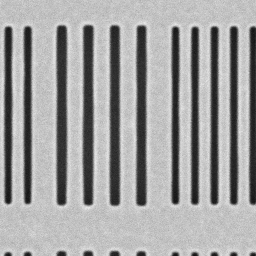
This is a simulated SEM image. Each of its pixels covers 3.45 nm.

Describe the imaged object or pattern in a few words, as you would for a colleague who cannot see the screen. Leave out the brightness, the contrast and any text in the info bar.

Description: groups of lines, slits or small figures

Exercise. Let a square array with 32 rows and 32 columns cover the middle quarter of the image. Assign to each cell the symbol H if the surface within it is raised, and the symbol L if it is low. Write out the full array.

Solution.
LHHHHLLHHHHLLLHHHHLLLHHHHHHLLHHH
LHHHHLLHHHHLLLHHHHLLLHHHHHHLLHHH
LHHHHLLHHHHLLLHHHHLLLHHHHHHLLHHH
LHHHHLLHHHHLLLHHHHLLLHHHHHHLLHHH
LHHHHLLHHHHLLLHHHHLLLHHHHHHLLHHH
LHHHHLLHHHHLLLHHHHLLLHHHHHHLLHHH
LHHHHLLHHHHLLLHHHHLLLHHHHHHLLHHH
LHHHHLLHHHHLLLHHHHLLLHHHHHHLLHHH
LHHHHLLHHHHLLLHHHHLLLHHHHHHLLHHH
LHHHHLLHHHHLLLHHHHLLLHHHHHHLLHHH
LHHHHLLHHHHLLLHHHHLLLHHHHHHLLHHH
LHHHHLLLHHHLLLHHHHLLLHHHHHHLLHHH
LHHHHLLLHHHLLLHHHHLLLHHHHHHLLHHH
LHHHHLLHHHHLLLHHHHLLLHHHHHHLLHHH
LHHHHLLHHHHLLLHHHHLLLHHHHHHLLHHH
LHHHHLLHHHHLLLHHHHLLLHHHHHHLLHHH
LHHHHLLHHHHLLLHHHHLLLHHHHHHLLHHH
LHHHHLLHHHHLLLHHHHLLLHHHHHHLLHHH
LHHHHLLHHHHLLLHHHHLLLHHHHHHLLHHH
LHHHLLLHHHHLLLHHHHLLLHHHHHHLLHHH
LHHHLLLHHHHLLLHHHHLLLHHHHHHLLHHH
LHHHLLLHHHHLLLHHHHLLLHHHHHHLLHHH
LHHHLLLLHHHLLLHHHHLLLHHHHHHLLHHH
LHHHLLLLHHHLLLHHHHLLLHHHHHHLLHHH
LHHHHLLLHHHLLLHHHHLLLHHHHHHLLHHH
LHHHHLLLHHHLLLHHHHLLLHHHHHHLLHHH
LHHHHLLHHHHLLLHHHHLLLHHHHHHLLHHH
LHHHHLLHHHHLLLHHHHLLLHHHHHHLLHHH
LHHHHLLHHHHLLLHHHHLLLHHHHHHLLHHH
LHHHHLLHHHHLLLHHHHLLLHHHHHHLLHHH
LHHHHLLHHHHLLLHHHHLLLHHHHHHLLHHH
LHHHHLLHHHHLLLHHHHLLLHHHHHHLLHHH